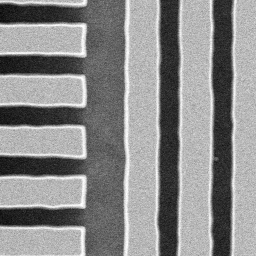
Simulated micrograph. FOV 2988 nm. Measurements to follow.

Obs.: groups of lines, slits or small figures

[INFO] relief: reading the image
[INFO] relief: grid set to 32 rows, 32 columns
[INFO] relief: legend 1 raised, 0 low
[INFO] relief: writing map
00111111110000001111000111000111
00000000000000001111001111000111
00000000000000001111001111100111
11111111111000001111001111100111
11111111111000001111001111100111
11111111110000001111001111000111
11111111110000001111000111000111
00000000000000001111000111000111
00000000000000001111000111000111
11111111110000001111000111000111
11111111111000001111000111000111
11111111111000001111001111100111
11111111111000001111000111100111
00000000000000001111000111100111
00000000000000001111000111100111
00000000000000001111001111100111
11111111110000001111001111000111
11111111111000001111001111000111
11111111111000001111001111000111
00000001110000001111001111000111
00000000000000001111001111000111
00000000000000001111001111000111
11111111111000001111001111000111
11111111111000001111000111000111
11111111110000001111001111000111
11111111110000001111001111000111
00000000000000001111001111000111
00000000000000001111001111000111
11111111110000001111001111000111
11111111110000001111001111000111
11111111110000001111001111000111
11111111110000001111001111000111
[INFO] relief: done